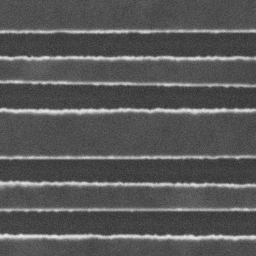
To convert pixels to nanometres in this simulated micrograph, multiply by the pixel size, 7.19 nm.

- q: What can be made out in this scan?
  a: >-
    lines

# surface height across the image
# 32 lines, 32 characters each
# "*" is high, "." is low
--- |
********************************
********************************
********************************
********************************
................................
................................
................................
********************************
********************************
********************************
...........*********************
................................
................................
................................
********************************
********************************
********************************
********************************
********************************
********************************
................................
................................
................................
********************************
********************************
********************************
................................
................................
................................
*******.*****.***.*..*..........
********************************
********************************